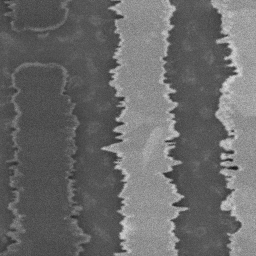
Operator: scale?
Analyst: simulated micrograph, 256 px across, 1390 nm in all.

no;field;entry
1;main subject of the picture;one or a few lines or trenches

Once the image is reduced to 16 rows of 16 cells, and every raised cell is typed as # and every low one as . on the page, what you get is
.###...####..###
.###...####...##
........##....##
.......###.....#
.###...###.....#
.###...###....##
.####...###...##
.####...###...##
.####..####...##
.####..####...##
.####...###...##
.###....###...##
.####...###...##
.####...###....#
.####...###....#
.####...###...##